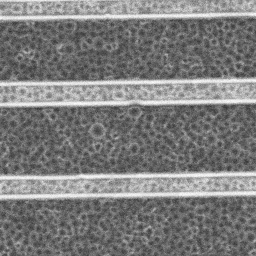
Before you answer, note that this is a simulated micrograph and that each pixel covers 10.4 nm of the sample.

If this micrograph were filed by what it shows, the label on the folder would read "one or a few lines or trenches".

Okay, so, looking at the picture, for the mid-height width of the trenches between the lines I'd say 0.725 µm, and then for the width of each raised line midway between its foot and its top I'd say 199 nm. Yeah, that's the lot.